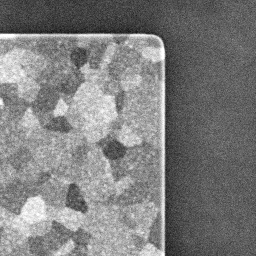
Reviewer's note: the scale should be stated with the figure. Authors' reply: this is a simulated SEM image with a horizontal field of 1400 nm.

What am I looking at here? wiring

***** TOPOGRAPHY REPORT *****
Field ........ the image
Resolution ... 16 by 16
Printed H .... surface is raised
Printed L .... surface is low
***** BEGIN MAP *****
LLLLLLLLLLLLLLLL
LLLLLLLLLLLLLLLL
HHHHHHHHHHLLLLLL
HHHHHHHHHHLLLLLL
HHHHHHHHHHLLLLLL
HHHHHHHHHHLLLLLL
HHHHHHHHHHLLLLLL
HHHHHHHHHHLLLLLL
HHHHHHHHHHLLLLLL
HHHHHHHHHHLLLLLL
HHHHHHHHHHLLLLLL
HHHHHHHHHHLLLLLL
HHHHHHHHHHLLLLLL
HHHHHHHHHHLLLLLL
HHHHHHHHHHLLLLLL
HHHHHHHHHHLLLLLL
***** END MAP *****